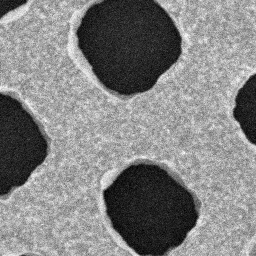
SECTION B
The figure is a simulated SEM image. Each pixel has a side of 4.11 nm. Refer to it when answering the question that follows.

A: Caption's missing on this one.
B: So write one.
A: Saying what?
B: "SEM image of holes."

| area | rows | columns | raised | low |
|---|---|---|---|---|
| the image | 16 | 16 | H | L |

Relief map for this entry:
LHHHHLLLLLHHHHHH
HHHHHLLLLLLHHHHH
HHHHHLLLLLLHHHHH
HHHHHLLLLLLHHHHH
HHHHHHLLLLHHHHHH
HHHHHHLLLHHHHHHL
LLHHHHHHHHHHHHHL
LLHHHHHHHHHHHHHL
LLLHHHHHHHHHHHHL
LLLHHHHHHHHHHHHH
LLHHHHHHLLLHHHHH
LHHHHHHLLLLLHHHH
HHHHHHLLLLLLHHHH
HHHHHHHLLLLLHHHH
HHHHHHHLLLLLHHHH
HHHHHHHHLLLHHHHH